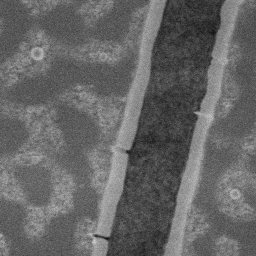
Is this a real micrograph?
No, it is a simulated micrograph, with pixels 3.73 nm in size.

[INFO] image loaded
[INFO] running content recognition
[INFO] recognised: one or a few lines or trenches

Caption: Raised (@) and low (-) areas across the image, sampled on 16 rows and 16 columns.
@@@@@@@@@@----@@
@@@@@@@@@@----@@
@@@@@@@@@-----@@
@@@@@@@@@-----@@
@@@@@@@@@----@@@
@@@@@@@@@----@@@
@@@@@@@@-----@@@
@@@@@@@@-----@@@
@@@@@@@@-----@@@
@@@@@@@@----@@@@
@@@@@@@-----@@@@
@@@@@@@-----@@@@
@@@@@@@-----@@@@
@@@@@@@----@@@@@
@@@@@@-----@@@@@
@@@@@@-----@@@@@